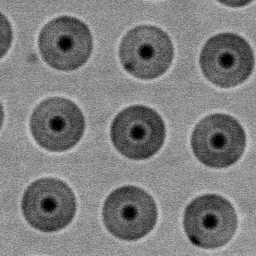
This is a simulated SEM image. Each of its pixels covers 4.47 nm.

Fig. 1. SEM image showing an array of small figures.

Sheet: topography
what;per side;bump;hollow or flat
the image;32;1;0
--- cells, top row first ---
11111111111111111111111111110001
11111111111111111111111111111111
01111100001111111111111111111111
00111000000111110000111111111111
00111001100011100000011111100011
01111001110011100110001110000001
01111001100011100111001110011000
11111000000111100110001110011100
11111100001111100000011110011000
11111111111111110000111110000001
11111111111111111111111111000011
11111111111111111111111111111111
11111000011111111111111111111111
11110000001111110001111111111111
01110011001111000000111111000111
11110011100111001100011100000011
11110011001111001110011100010001
11110000001111001100011100111001
11111000011111000000111100110001
11111111111111100001111100000011
11111111111111111111111110000111
11111111111111111111111111111111
11110000111111111111111111111111
11100000011111100011111111111111
11100110011110000001111110001111
11100110001110011000111000000111
11100110001110011100111000100011
11100000011110011000111001110011
11110000111110000001111001100011
11111111111111000011111000000111
11111111111111111111111100001111
11111111111111111111111111111111